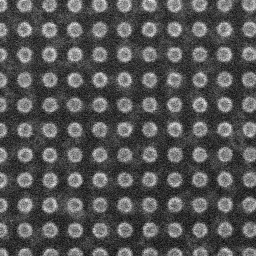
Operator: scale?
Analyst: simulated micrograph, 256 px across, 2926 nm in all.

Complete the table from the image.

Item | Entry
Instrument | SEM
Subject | a regular array of raised bodies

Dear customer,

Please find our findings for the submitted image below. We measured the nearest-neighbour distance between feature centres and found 0.283 micrometres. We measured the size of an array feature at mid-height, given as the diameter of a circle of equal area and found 0.145 micrometres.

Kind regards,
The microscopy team